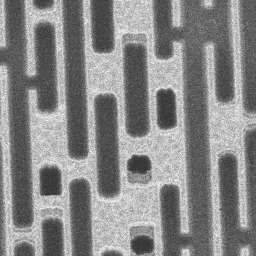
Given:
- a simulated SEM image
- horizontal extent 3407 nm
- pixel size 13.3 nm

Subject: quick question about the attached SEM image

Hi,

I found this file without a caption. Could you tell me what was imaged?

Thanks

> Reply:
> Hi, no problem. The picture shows parallel lines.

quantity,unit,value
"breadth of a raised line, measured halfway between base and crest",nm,136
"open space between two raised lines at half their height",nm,249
